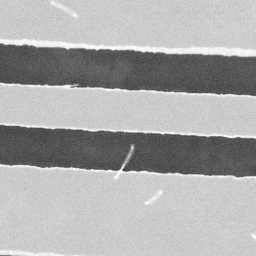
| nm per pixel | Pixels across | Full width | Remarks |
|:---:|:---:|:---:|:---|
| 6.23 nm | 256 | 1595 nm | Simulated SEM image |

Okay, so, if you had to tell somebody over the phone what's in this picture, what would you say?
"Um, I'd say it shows lines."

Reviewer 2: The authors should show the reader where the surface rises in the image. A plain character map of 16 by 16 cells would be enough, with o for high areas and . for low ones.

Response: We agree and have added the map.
oooooooooooooooo
oooooooooooooooo
oooooooooooooooo
................
................
ooooo...........
oooooooooooooooo
oooooooooooooooo
.............ooo
................
oooo............
oooooooooooooooo
oooooooooooooooo
oooooooooooooooo
oooooooooooooooo
oooooooooooooooo